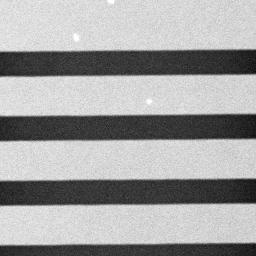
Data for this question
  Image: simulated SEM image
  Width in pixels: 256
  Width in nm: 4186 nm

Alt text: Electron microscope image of groups of lines, slits or small figures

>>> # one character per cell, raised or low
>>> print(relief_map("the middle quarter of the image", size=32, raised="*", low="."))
................................
................................
................................
********************************
********************************
********************************
********************************
********************************
********************************
********************************
********************************
********************************
**********************...*......
................................
................................
................................
................................
................................
................................
********************************
********************************
********************************
********************************
********************************
********************************
********************************
********************************
********************************
********************************
................................
................................
................................